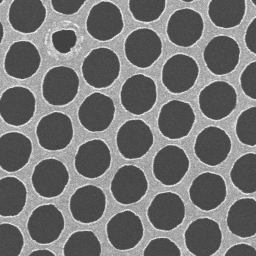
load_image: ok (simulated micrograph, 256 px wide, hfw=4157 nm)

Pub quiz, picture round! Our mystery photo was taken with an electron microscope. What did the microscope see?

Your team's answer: a regular array of holes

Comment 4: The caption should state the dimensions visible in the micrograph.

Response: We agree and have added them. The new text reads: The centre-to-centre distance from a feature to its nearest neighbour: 0.736 µm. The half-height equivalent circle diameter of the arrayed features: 613 nm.